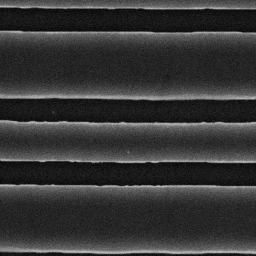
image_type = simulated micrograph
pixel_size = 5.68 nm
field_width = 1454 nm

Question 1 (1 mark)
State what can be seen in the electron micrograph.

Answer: lines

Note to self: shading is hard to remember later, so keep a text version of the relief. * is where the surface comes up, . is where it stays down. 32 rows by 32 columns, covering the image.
********************************
................................
................................
................................
********************************
********************************
********************************
********************************
********************************
********************************
********************************
********************************
................................
................................
................................
*********************...********
********************************
********************************
********************************
********************************
................................
................................
................................
********************************
********************************
********************************
********************************
********************************
********************************
********************************
********************************
...........******...******.*.***